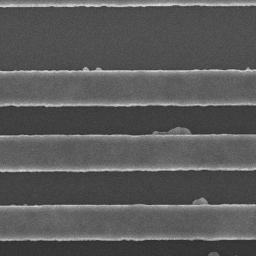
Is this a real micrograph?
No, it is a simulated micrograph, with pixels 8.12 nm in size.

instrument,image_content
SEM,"lines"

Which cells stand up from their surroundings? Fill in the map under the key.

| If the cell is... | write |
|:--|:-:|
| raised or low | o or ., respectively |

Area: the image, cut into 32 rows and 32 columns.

oooooooooooooooooooooooooooooooo
................................
................................
................................
................................
................................
................................
................................
................................
oooooooooooooooooooooooooooooooo
oooooooooooooooooooooooooooooooo
oooooooooooooooooooooooooooooooo
oooooooooooooooooooooooooooooooo
................................
................................
................................
................................
oooooooooooooooooooooooooooooooo
oooooooooooooooooooooooooooooooo
oooooooooooooooooooooooooooooooo
oooooooooooooooooooooooooooooooo
................................
................................
................................
................................
................................
oooooooooooooooooooooooooooooooo
oooooooooooooooooooooooooooooooo
oooooooooooooooooooooooooooooooo
oooooooooooooooooooooooooooooooo
................................
................................